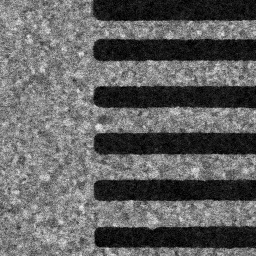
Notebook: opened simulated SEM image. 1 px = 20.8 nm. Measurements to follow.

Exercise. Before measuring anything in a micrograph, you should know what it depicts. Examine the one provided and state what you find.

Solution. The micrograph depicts parallel lines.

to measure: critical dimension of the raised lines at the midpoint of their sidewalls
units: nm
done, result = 501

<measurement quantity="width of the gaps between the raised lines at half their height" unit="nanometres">457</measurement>